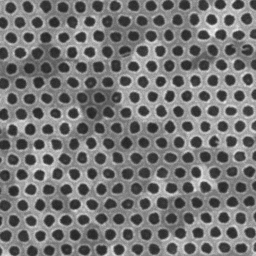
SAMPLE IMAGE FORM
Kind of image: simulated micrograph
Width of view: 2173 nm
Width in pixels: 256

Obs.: a regular array of holes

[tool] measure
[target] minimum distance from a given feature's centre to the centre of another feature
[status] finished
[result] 144 nm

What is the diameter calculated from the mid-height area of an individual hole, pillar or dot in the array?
101 nanometers